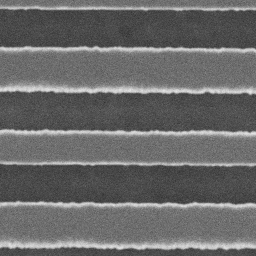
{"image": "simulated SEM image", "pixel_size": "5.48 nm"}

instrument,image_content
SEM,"lines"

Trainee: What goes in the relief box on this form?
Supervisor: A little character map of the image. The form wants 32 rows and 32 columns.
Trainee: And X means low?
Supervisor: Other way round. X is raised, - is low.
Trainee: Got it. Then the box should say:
XXXXXXXXXXXXXXXXXXXXXXXXXXXXXXXX
--------------------------------
--------------------------------
--------------------------------
--------------------------------
--------------------------------
XXXXXXXXXXXXXXXXXXXXXXXXXXXXXXXX
XXXXXXXXXXXXXXXXXXXXXXXXXXXXXXXX
XXXXXXXXXXXXXXXXXXXXXXXXXXXXXXXX
XXXXXXXXXXXXXXXXXXXXXXXXXXXXXXXX
XXXXXXXXXXXXXXXXXXXXXXXXXXXXXXXX
--------XX-X-XXXXXXXXXXXXXXXXXXX
--------------------------------
--------------------------------
--------------------------------
--------------------------------
XXXXXXXXXXXXXXXXXXXXXXXXXXXXXXXX
XXXXXXXXXXXXXXXXXXXXXXXXXXXXXXXX
XXXXXXXXXXXXXXXXXXXXXXXXXXXXXXXX
XXXXXXXXXXXXXXXXXXXXXXXXXXXXXXXX
----XX----XX---X-XXXXXXXXXXXXXXX
--------------------------------
--------------------------------
--------------------------------
--------------------------------
XXXXXXXXXXXXXXXXXXXXXX--XXXXX--X
XXXXXXXXXXXXXXXXXXXXXXXXXXXXXXXX
XXXXXXXXXXXXXXXXXXXXXXXXXXXXXXXX
XXXXXXXXXXXXXXXXXXXXXXXXXXXXXXXX
XXXXXXXXXXXXXXXXXXXXXXXXXXXXXXXX
XXXXXXXXXXXXXXXXXXXXXXXXXXXXXXXX
--------------------------------